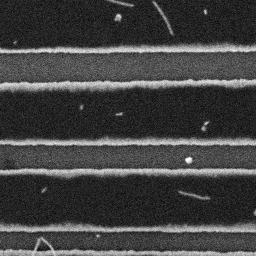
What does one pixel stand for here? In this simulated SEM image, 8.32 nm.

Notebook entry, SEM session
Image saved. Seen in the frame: lines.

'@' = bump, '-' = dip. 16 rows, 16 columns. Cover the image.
@@@@@@@@@@@@@@@@
@@@@@@@@@@@@@@@@
@@@@@@@@@@@@@@@@
----------------
----------------
@@@@@@@@@@@@@@@@
@@@@@@@@@@@@@@@@
@@@@@@@@@@@@@@@@
@@@@@@@@@@@@@@@@
----------------
----------------
@@@@@@@@@@@@@@@@
@@@@@@@@@@@@@@@@
@@@@@@@@@@@@@@@@
----------------
----------------